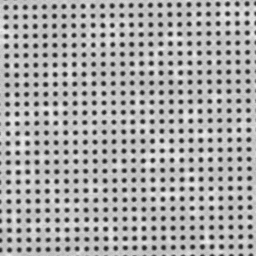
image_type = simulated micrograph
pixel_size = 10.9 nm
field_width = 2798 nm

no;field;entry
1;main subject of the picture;a regular array of holes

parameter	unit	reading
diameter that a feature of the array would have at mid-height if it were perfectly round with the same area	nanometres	60.4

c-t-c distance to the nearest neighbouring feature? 103 nanometres